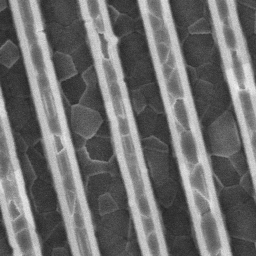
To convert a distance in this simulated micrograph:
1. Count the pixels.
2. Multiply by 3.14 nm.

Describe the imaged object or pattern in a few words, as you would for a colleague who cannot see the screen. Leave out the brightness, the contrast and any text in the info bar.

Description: one or a few lines or trenches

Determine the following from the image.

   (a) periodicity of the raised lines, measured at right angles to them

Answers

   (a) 197 nanometres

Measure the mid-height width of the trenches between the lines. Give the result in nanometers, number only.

142